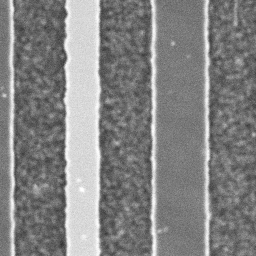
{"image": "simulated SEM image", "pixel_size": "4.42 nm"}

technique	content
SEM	lines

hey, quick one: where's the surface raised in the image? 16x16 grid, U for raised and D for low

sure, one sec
UDDDUUDDDDUUUDDD
UDDDUUDDDDUUUDDD
UDDDUUDDDDUUUDDD
UDDDUUDDDDUUUDDD
UDDDUUDDDDUUUDDD
UDDDUUDDDDUUUDDD
UDDDUUDDDDUUUDDD
UDDDUUDDDDUUUDDD
UDDDUUDDDDUUUDDD
UDDDUUDDDDUUUDDD
UDDDUUDDDDUUUDDD
UDDDUUDDDDUUUDDD
UDDDUUDDDDUUUDDD
UDDDUUDDDDUUUDDD
UDDDUUDDDDUUUDDD
UDDDUUDDDDUUUDDD